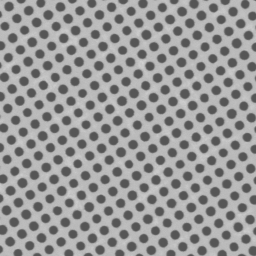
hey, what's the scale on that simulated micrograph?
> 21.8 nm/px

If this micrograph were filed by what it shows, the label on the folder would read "a regular array of holes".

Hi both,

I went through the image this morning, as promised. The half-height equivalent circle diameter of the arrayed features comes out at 0.206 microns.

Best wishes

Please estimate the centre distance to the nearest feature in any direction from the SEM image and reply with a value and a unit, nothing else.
304 nanometres